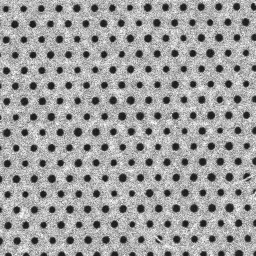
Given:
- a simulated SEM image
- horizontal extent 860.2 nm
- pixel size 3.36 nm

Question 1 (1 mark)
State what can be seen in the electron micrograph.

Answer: a regular array of holes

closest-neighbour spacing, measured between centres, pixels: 17.4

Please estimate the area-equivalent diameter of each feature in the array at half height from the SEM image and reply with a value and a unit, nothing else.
22.4 nanometers